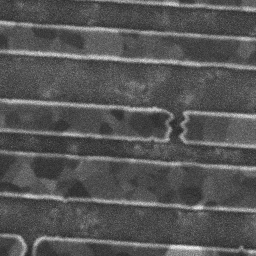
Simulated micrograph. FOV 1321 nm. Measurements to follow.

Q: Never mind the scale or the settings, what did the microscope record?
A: one or a few lines or trenches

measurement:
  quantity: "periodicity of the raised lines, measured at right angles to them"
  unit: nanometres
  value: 351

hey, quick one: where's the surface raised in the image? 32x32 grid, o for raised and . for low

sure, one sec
......................oooooooooo
................................
................................
ooooooooo.......................
oooooooooooooooooooooooo........
oooooooooooooooooooooooooooooooo
.ooooooooooooooooooooooooooooooo
................oooooooooooooooo
................................
................................
................................
................................
................................
oooooooooooooooo................
ooooooooooooooooooooo..ooooooo..
ooooooooooooooooooooo..ooooooooo
...oooooooooooooooooo..ooooooooo
.......................ooooooooo
................................
oooooooo........................
ooooooooooooooooooooo.o.........
oooooooooooooooooooooooooooooooo
oooooooooooooooooooooooooooooooo
oooooooooooooooooooooooooooooooo
....oooooooooooooooooooooooooooo
...................ooooooooooooo
................................
................................
................................
o...............................
ooo..ooooooooooo................
ooo.oooooooooooooooooooooooooooo